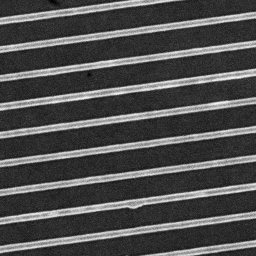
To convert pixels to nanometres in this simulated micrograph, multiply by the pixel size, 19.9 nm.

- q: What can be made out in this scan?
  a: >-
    parallel lines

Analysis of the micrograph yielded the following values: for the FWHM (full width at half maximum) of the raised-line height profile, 0.118 µm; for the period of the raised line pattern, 0.562 µm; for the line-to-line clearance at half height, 451 nm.